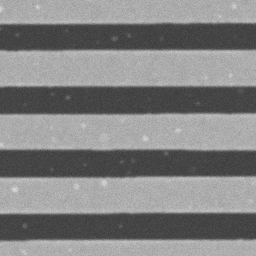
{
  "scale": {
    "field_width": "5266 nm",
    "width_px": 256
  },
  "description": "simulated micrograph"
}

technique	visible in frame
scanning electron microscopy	lines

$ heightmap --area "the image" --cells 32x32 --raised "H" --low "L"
HHHHHHHHHHHHHHHHHHHHHHHHHHHHHHHH
HHHHHHHHHHHHHHHHHHHHHHHHHHHHHHHH
HHHHHHHHHHHHHHHHHHHHHHHHHHHHHHHH
LLLLLLLLLLLLLLLLLLLLLLLLLLLLLLLL
LLLLLLLLLLLLLLLLLLLLLLLLLLLLLLLL
LLLLLLLLLLLLLLLLLLLLLLLLLLLLLLLL
HHHHHHHHHHHHHHHHHHHHHHHHHHHHHHHH
HHHHHHHHHHHHHHHHHHHHHHHHHHHHHHHH
HHHHHHHHHHHHHHHHHHHHHHHHHHHHHHHH
HHHHHHHHHHHHHHHHHHHHHHHHHHHHHHHH
HHHHHHHHHHHHHHHHHHHHHHHHHHHHHHHH
LLLLLLLLLLLLLLLLLLLLLLLLLLLLLLLL
LLLLLLLLLLLLLLLLLLLLLLLLLLLLLLLL
LLLLLLLLLLLLLLLLLLLLLLLLLLLLLLLL
HHHHHHHHHHHHHHHHHHHHHHHHHHHHHHHH
HHHHHHHHHHHHHHHHHHHHHHHHHHHHHHHH
HHHHHHHHHHHHHHHHHHHHHHHHHHHHHHHH
HHHHHHHHHHHHHHHHHHHHHHHHHHHHHHHH
HHHHHHHHHHHHHHHHHHHHHHHHHHHHHHHH
LLLLLLLLLLLLLLLLLLLLLLLLLLLLLLLL
LLLLLLLLLLLLLLLLLLLLLLLLLLLLLLLL
LLLLLLLLLLLLLLLLLLLLLLLLLLLLLLLL
HHHHHHHHHHHHHHHHHHHHHHHHHHHHHHHH
HHHHHHHHHHHHHHHHHHHHHHHHHHHHHHHH
HHHHHHHHHHHHHHHHHHHHHHHHHHHHHHHH
HHHHHHHHHHHHHHHHHHHHHHHHHHHHHHHH
HHHHHHHHHHHHHHHHHHHHHHHHHHHHHHHH
LLLLLLLLLLLLLLLLLLLLLLLLLLLLLLLL
LLLLLLLLLLLLLLLLLLLLLLLLLLLLLLLL
LLLLLLLLLLLLLLLLLLLLLLLLLLLLLLLL
HHHHHHHHHHHHHHHHHHHHHHHHHHHHHHHH
HHHHHHHHHHHHHHHHHHHHHHHHHHHHHHHH